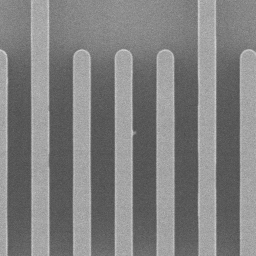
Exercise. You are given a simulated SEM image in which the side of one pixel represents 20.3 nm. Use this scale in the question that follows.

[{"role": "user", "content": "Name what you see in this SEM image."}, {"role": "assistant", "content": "groups of lines, slits or small figures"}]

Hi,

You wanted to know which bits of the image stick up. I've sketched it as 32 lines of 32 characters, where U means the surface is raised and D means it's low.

DDDDUUDDDDDDDDDDDDDDDDDDDUUDDDDD
DDDDUUDDDDDDDDDDDDDDDDDDDUUDDDDD
DDDDUUDDDDDDDDDDDDDDDDDDDUUDDDDD
DDDDUUDDDDDDDDDDDDDDDDDDDUUDDDDD
DDDDUUDDDDDDDDDDDDDDDDDDDUUDDDDD
DDDDUUDDDDDDDDDDDDDDDDDDDUUDDDDD
UDDDUUDDDDUDDDDUDDDDUDDDDUUDDDUU
UDDDUUDDDUUDDDUUUDDDUUDDDUUDDDUU
UDDDUUDDDUUDDDUUUDDDUUDDDUUDDDUU
UDDDUUDDDUUDDDUUUDDDUUDDDUUDDDUU
UDDDUUDDDUUDDDUUDDDDUUDDDUUDDDUU
UDDDUUDDDUUDDDUUDDDDUUDDDUUDDDUU
UDDDUUDDDUUDDDUUDDDDUUDDDUUDDDUU
UDDDUUDDDUUDDDUUUDDDUUDDDUUDDDUU
UDDDUUDDDUUDDDUUUDDDUUDDDUUDDDUU
UDDDUUDDDUUDDDUUUDDDUUDDDUUDDDUU
UDDDUUDDDUUDDDUUUDDDUUDDDUUDDDUU
UDDDUUDDDUUDDDUUUDDDUUDDDUUDDDUU
UDDDUUDDDUUDDDUUUDDDUUDDDUUDDDUU
UDDDUUDDDUUDDDUUUDDDUUDDDUUDDDUU
UDDDUUDDDUUDDDUUUDDDUUDDDUUDDDUU
UDDDUUDDDUUDDDUUUDDDUUDDDUUDDDUU
UDDDUUDDDUUDDDUUUDDDUUDDDUUDDDUU
UDDDUUDDDUUDDDUUUDDDUUDDDUUDDDUU
UDDDUUDDDUUDDDUUUDDDUUDDDUUDDDUU
UDDDUUDDDUUDDDUUUDDDUUDDDUUDDDUU
UDDDUUDDDUUDDDUUUDDDUUDDDUUDDDUU
UDDDUUDDDUUDDDUUUDDDUUDDDUUDDDUU
UDDDUUDDDUUDDDUUUDDDUUDDDUUDDDUU
UDDDUUDDDUUDDDUUUDDDUUDDDUUDDDUU
UDDDUUDDDUUDDDUUUDDDUUDDDUUDDDUU
UDDDUUDDDUUDDDUUUDDDUUDDDUUDDDUU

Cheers